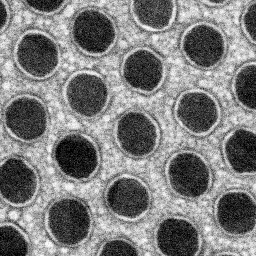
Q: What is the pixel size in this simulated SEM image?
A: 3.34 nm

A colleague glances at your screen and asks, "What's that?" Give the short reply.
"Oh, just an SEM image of a regular array of raised bodies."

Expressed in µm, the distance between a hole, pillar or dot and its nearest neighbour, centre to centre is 0.212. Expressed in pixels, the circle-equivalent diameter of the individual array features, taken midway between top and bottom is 45.9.